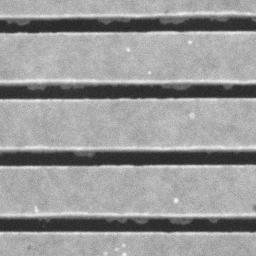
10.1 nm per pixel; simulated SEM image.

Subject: lines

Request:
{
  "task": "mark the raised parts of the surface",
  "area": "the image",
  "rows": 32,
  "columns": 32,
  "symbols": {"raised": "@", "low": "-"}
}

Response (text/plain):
@@@@@@@@@@@@@@@@@@@@@@@@@@@@@@@@
@@@@@@@@@@@@@@@@@@@@@@@@@@@@@@@@
--------------------------------
--------------------------------
@@@@@@@@@@@@@@@@@@@@@@@@@@@@@@@@
@@@@@@@@@@@@@@@@@@@@@@@@@@@@@@@@
@@@@@@@@@@@@@@@@@@@@@@@@@@@@@@@@
@@@@@@@@@@@@@@@@@@@@@@@@@@@@@@@@
@@@@@@@@@@@@@@@@@@@@@@@@@@@@@@@@
@@@@@@@@@@@@@@@@@@@@@@@@@@@@@@@@
--------------------------------
--------------------------------
@@@@@@@@@@@@@@@@@@@@@@@@@@@@@@@@
@@@@@@@@@@@@@@@@@@@@@@@@@@@@@@@@
@@@@@@@@@@@@@@@@@@@@@@@@@@@@@@@@
@@@@@@@@@@@@@@@@@@@@@@@@@@@@@@@@
@@@@@@@@@@@@@@@@@@@@@@@@@@@@@@@@
@@@@@@@@@@@@@@@@@@@@@@@@@@@@@@@@
@@@@@@@@@@@@@@@@@@@@@@@@@@@@@@@@
--------------------------------
--------------------------------
@@@@@@@@@@@@@@@@@@@@@@@@@@@@@@@@
@@@@@@@@@@@@@@@@@@@@@@@@@@@@@@@@
@@@@@@@@@@@@@@@@@@@@@@@@@@@@@@@@
@@@@@@@@@@@@@@@@@@@@@@@@@@@@@@@@
@@@@@@@@@@@@@@@@@@@@@@@@@@@@@@@@
@@@@@@@@@@@@@@@@@@@@@@@@@@@@@@@@
--------------------------------
--------------------------------
@@@@@@@@@@@@@@@@@@@@@@@@@@@@@@@@
@@@@@@@@@@@@@@@@@@@@@@@@@@@@@@@@
@@@@@@@@@@@@@@@@@@@@@@@@@@@@@@@@